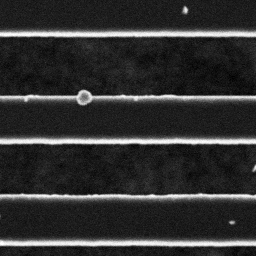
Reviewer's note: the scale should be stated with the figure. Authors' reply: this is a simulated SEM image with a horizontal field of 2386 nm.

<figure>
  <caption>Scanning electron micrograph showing lines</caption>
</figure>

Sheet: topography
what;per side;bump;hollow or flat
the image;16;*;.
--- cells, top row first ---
****************
****************
................
................
................
................
****************
****************
****************
................
................
................
****************
****************
****************
................